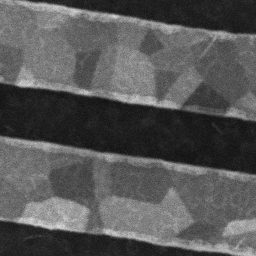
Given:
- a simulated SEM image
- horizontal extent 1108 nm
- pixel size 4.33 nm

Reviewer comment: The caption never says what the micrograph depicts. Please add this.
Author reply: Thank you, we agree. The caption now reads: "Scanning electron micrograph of one or a few lines or trenches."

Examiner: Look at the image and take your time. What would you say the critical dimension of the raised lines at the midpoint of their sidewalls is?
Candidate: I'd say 354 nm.